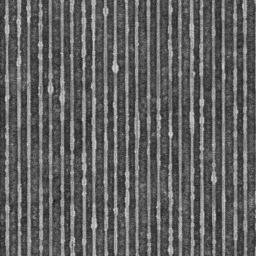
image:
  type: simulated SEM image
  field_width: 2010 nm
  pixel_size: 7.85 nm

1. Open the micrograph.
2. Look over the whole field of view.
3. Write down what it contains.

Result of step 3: parallel lines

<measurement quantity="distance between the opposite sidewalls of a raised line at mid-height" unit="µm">0.0206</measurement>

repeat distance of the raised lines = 84.9 nanometers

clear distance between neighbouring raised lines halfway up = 63.8 nm